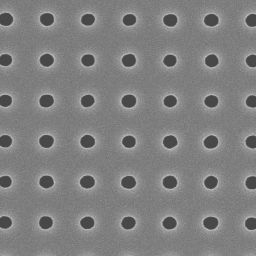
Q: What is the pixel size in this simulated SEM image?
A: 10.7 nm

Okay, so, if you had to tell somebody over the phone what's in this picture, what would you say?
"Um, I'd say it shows a regular array of holes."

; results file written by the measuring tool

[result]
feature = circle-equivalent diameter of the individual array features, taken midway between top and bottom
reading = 148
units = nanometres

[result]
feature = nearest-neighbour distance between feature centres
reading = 40.5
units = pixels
